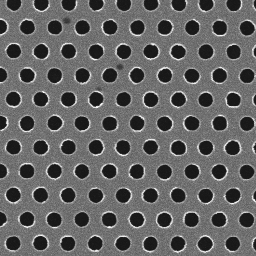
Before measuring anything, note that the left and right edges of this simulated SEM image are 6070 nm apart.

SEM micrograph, a regular array of holes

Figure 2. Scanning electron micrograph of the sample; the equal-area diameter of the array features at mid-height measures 14.6 px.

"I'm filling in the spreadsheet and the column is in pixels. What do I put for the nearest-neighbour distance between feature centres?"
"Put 27.1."